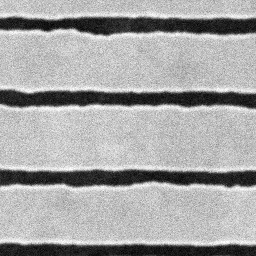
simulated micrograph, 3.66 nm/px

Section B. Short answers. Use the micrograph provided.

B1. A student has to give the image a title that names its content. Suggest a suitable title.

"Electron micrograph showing lines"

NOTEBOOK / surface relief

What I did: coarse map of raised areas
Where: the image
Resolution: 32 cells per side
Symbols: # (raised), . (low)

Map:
################################
################################
................................
................................
#############.##################
################################
################################
################################
################################
################################
################################
...#.............#............##
................................
###############################.
################################
################################
################################
################################
################################
################################
################################
................................
................................
################################
################################
################################
################################
################################
################################
################################
........................####...#
................................